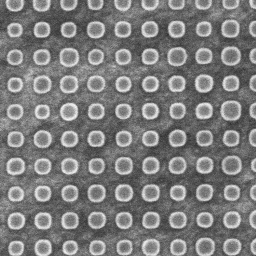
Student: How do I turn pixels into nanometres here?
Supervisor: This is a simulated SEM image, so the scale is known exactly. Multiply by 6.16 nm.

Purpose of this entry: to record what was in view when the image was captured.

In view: a regular array of raised bodies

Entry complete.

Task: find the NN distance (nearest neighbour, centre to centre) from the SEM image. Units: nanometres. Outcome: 165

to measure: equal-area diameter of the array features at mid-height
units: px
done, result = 15.9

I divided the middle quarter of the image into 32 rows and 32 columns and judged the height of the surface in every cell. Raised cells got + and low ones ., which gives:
................................
................................
................................
+++...++++....++.....++....+++..
+++...++++...+++....+++...++++..
+++...++++...+++....+++...++++..
+++....++.....++....+++....+++..
................................
................................
................................
+++....++.....++....+++....+++..
+++...++++...++++...+++....+++..
+++...++++...++++...+++....+++..
+++....+....................+...
................................
................................
................................
+++....+++...++++...+++....+++..
+++...++++...++++...+++....+++..
+++...++++...++++...+++....+++..
.......++.......................
................................
................................
..............++................
+++....+++...++++...+++....+++..
+++...++++...++++...+++....+++..
+++....+++...++++...+++....+++..
................................
................................
................................
.......++.....++.....++.....+...
+++...++++...++++...++++...+++..